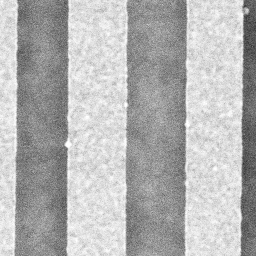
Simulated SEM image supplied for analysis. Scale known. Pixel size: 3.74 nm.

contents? lines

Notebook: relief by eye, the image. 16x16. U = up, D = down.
UDDDUUUUDDDDUUUD
UDDDUUUUDDDDUUUD
UDDDUUUUDDDDUUUD
UDDDUUUUDDDDUUUD
UDDDUUUUDDDDUUUD
UDDDUUUUDDDDUUUD
UDDDUUUUDDDDUUUD
UDDDUUUUDDDDUUUD
UDDDUUUUDDDDUUUD
UDDDUUUUDDDDUUUD
UDDDUUUUDDDDUUUD
UDDDUUUUDDDDUUUD
UDDDUUUUDDDDUUUD
UDDDUUUUDDDDUUUD
UDDDUUUUDDDDUUUD
UDDDUUUUDDDDUUUD